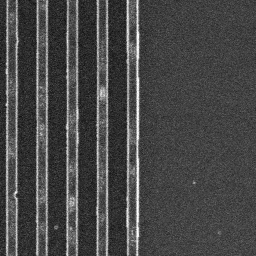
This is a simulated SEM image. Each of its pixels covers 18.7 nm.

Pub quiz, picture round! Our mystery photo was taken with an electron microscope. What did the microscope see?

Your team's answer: parallel lines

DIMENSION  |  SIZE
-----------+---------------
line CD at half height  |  0.182 microns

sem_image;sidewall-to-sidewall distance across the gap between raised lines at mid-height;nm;384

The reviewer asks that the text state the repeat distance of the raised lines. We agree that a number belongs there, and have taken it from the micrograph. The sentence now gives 565 nm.